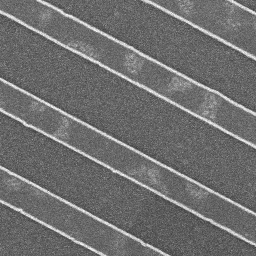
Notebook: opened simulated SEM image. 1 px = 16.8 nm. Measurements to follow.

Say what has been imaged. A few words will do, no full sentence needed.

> one or a few lines or trenches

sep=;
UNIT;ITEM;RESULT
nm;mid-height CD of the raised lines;479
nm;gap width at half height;863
